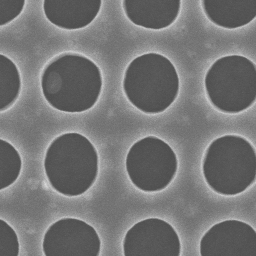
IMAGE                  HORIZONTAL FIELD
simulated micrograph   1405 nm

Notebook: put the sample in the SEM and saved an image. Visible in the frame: holes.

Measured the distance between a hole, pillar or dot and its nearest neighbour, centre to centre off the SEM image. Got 0.439 µm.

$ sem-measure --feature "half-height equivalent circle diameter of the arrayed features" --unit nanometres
315